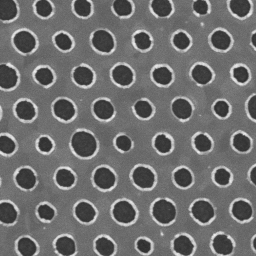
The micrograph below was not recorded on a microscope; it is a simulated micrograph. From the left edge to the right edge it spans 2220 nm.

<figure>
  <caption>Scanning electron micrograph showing a regular array of holes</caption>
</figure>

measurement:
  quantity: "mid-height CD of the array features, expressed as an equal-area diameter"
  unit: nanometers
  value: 168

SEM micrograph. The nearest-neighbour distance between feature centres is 0.337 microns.